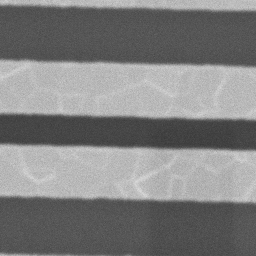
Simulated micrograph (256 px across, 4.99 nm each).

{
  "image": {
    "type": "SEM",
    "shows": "lines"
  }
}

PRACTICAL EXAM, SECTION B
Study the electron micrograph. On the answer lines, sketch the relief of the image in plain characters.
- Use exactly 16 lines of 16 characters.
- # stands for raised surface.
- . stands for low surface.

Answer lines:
..........######
................
................
................
################
################
################
................
................
################
################
################
............####
................
................
................